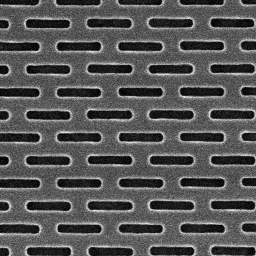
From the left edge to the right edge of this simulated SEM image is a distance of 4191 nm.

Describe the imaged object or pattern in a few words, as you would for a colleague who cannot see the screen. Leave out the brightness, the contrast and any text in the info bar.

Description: a regular array of holes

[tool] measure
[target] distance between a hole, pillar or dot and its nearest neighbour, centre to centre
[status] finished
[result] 621 nm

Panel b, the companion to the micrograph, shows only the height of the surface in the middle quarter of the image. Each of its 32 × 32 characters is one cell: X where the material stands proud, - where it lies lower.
-XXXXX-----------XXXX-----------
--XXXX-----------XXXX-----------
-XXXXXX---------XXXXXXXXXXXX---X
XXXXXXXXXXXXXXXXXXXXXXXXXXXXXXXX
XXXXXXXXXXXXXXXXXXXXXXXXXXXXXXXX
XXXXXXXXXXXXXXXXXXXXXXXXXXXXXXXX
---------XXXXX-----------XXXX---
---------XXXXX-----------XXXX---
XXXXXXXXXXXXXXXXXXXXXXXXXXXXXXXX
XXXXXXXXXXXXXXXXXXXXXXXXXXXXXXXX
XXXXXXXXXXXXXXXXXXXXXXXXXXXXXXXX
XXXXXXX-------X-XXXXXX---------X
--XXXX-----------XXXX-----------
--XXXX-----------XXXX-----------
XXXXXXXXXXXXXXXXXXXXXXXXXXXXXXXX
XXXXXXXXXXXXXXXXXXXXXXXXXXXXXXXX
XXXXXXXXXXXXXXXXXXXXXXXXXXXXXXXX
---------XXXXX----------XXXXX---
---------XXXXX-----------XXXX---
---------XXXXXX---------XXXXXXXX
XXXXXXXXXXXXXXXXXXXXXXXXXXXXXXXX
XXXXXXXXXXXXXXXXXXXXXXXXXXXXXXXX
XXXXXXXXXXXXXXXXXXXXXXXXXXXXXXXX
-XXXXX-----------XXXX-----------
--XXXX-----------XXXX-----------
XXXXXXXXXXXXXXXXXXXXXXXXXXXXXXXX
XXXXXXXXXXXXXXXXXXXXXXXXXXXXXXXX
XXXXXXXXXXXXXXXXXXXXXXXXXXXXXXXX
XXXXXXXXXXXXXXX-----XXXXXXXXXX--
---------XXXXX-----------XXXX---
---------XXXXX-----------XXXX---
XXXXXXXXXXXXXXXXXXXXXXXXXXXXXXXX